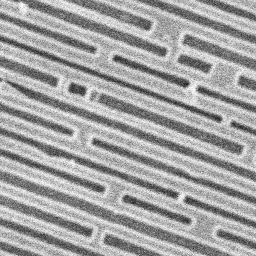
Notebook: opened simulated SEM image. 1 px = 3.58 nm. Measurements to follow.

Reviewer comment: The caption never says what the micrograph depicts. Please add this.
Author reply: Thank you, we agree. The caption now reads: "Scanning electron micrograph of parallel lines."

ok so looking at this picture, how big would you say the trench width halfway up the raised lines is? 33.1 nanometers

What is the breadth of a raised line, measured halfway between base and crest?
42.9 nm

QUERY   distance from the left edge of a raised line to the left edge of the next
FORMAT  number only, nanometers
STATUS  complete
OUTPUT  77